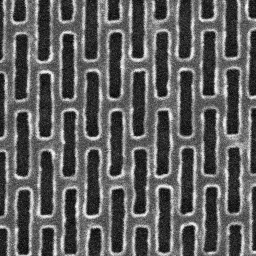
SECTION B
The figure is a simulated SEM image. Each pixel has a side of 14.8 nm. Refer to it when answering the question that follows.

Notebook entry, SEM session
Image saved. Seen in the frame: a regular array of holes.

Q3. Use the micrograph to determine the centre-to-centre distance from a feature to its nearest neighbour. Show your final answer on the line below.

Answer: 668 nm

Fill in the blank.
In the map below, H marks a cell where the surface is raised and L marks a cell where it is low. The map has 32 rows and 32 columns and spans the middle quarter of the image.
LLLHHHHHHHHLLLHHHHHHHHHLLLHHHHHH
LLLHHHHHHHHLLLHHHHHHHHHLLLHHHHLH
LLLHHHLLLHHLLLHHHLLLHHHLLLHHHLLL
LLLHHHLLLHHLLLLHHLLLHHHLLLHHHLLL
LLLHHHLLLHHLLLLHHLLLHHHLLLHHHLLL
LLLHHHLLLHHLLLHHHLLLLHHLLLHHHLLL
LLLHHLLLLHHLLLHHHLLLLHHLLLHHHLLL
LLLHHLLLLHHLLLHHHLLLHHHLLLHHHLLL
LLHHHLLLLHHHLLHHHLLLHHHHLHHHHLLL
HHHHHLLLLHHHHHHHHLLLLHHHHHHHHLLL
HHHHHLLLLHHHHHHHHLLLLHHHHHHHHLLL
HHHHHLLLLHHHHHHHHLLLLHHHLLHHHLLL
LLLHHLLLLHHHLLLHHLLLHHHLLLHHHLLL
LLLHHLLLLHHLLLLHHLLLHHHLLLHHHLLL
LLLHHLLLLHHLLLLHHLLLHHHLLLHHHLLL
LLLHHLLLLHHHLLLHHLLLHHHLLLLHHLLL
LLLHHLLLLHHLLLLHHLLLHHHLLLLHHLLL
LLLHHHLLLHHHLLLHHLLLHHHLLLLHHLLL
LLLHHHHHHHHHLLLHHHHHHHHLLLLHHHHH
LLLHHHHHHHHLLLLHHHHHHHHLLLLHHHHH
LLLHHHHHHHHLLLLHHHHHHHHLLLLHHHHH
LLLHHHLLLHHLLLLHHHLLHHHLLLLHHLLL
LLLHHHLLLHHLLLLHHLLLLHHLLLHHHLLL
LLLHHHLLLHHLLLLHHLLLLHHLLLHHHLLL
LLLHHHLLLHHLLLLHHHLLLHHLLLHHHLLL
LLLHHHLLLHHHLLLHHHLLLHHLLLHHHLLL
LLLHHHLLLHHLLLLHHLLLLHHLLLHHHLLL
LLLHHHLLLHHLLLHHHLLLLHHLLLHHHLLL
HHHHHHLLLHHHHHHHHLLLLHHHHHHHHLLL
HHHHHHLLLHHHHHHHHLLLLHHHHHHHHLLL
HHHHHHLLLHHHHHHHHLLLLHHHHHHHHLLL
HLLHHHLLLHHHLLLHHHLLLHHHLLLHHLLL